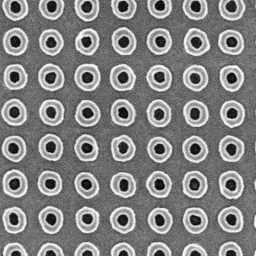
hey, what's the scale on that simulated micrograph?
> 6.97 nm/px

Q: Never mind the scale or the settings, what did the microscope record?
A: a regular array of ring-shaped raised bodies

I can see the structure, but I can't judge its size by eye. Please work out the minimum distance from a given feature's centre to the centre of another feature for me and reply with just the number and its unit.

244 nm